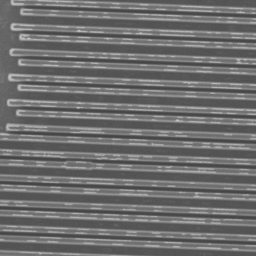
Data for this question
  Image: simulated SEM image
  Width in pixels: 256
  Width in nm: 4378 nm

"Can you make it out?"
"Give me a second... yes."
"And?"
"parallel lines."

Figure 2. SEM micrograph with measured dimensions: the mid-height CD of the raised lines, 115 nm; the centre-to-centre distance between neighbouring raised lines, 214 nm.